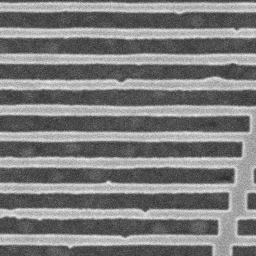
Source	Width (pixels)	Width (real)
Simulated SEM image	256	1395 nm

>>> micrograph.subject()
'parallel lines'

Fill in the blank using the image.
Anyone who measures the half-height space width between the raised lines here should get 0.0885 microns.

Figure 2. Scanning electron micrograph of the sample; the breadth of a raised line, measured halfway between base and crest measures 51.7 nanometres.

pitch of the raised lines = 141 nm